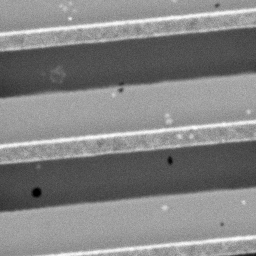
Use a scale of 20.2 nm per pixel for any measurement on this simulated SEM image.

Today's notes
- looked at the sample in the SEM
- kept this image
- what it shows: lines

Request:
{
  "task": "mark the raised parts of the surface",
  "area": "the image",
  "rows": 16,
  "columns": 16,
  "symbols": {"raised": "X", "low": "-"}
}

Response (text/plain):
XXXXXXXXXXXXXXXX
XXXXXXXXXXXXXXXX
XXXXXXX---------
----------------
----------------
-------XXXXXXXXX
XXXXXXXXXXXXXXXX
XXXXXXXXXXXXXXXX
XXXXXXXXXXXXXXXX
XXXXXXXX--------
----------------
----------------
--------XXXXXXXX
XXXXXXXXXXXXXXXX
XXXXXXXXXXXXXXXX
XXXXXXXXXXXXXXXX